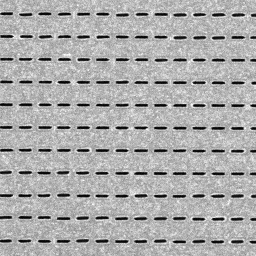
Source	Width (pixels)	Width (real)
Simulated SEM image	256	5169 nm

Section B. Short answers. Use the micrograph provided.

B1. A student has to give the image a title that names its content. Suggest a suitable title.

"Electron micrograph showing a regular array of holes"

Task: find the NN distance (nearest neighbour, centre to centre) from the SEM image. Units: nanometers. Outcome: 384